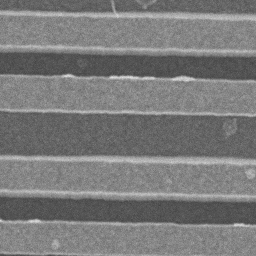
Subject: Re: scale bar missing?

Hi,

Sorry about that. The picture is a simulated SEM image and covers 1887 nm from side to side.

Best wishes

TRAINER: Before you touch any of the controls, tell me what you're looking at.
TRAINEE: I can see lines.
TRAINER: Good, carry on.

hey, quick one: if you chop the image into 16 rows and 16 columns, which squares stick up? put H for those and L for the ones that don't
LLLLLLLLLLLLLLLL
HHHHHHHHHHHHHHHH
HHHHHHHHHHHHHHHH
LLLLLLLLLLLLLLLL
LLLLLLLLLLLLLLLL
HHHHHHHHHHHHHHHH
HHHHHHHHHHHHHHHH
LLLLLLLLLLLLLLLL
LLLLLLLLLLLLLLLL
LLLLLLLLLLLLLLLL
HHHHHHHHHHHHHHHH
HHHHHHHHHHHHHHHH
LLLLLLLLLLLLLLLL
LLLLLLLLLLLLLLLL
HHHHHHHHHHHHHHHH
HHHHHHHHHHHHHHHH